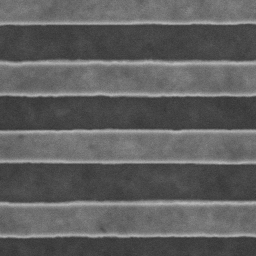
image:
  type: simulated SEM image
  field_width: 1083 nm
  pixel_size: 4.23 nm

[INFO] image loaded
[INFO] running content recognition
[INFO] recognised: lines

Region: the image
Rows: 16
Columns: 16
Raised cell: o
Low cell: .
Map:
oooooooooooooooo
ooooooooo.oo.oo.
................
................
oooooooooooooooo
oooooooooooooooo
................
................
oooooooooooooooo
oooooooooooooooo
................
................
................
oooooooooooooooo
oooooooooooooooo
................